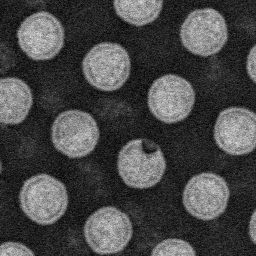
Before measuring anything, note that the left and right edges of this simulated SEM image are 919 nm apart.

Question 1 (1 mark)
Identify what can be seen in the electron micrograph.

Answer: a regular array of raised bodies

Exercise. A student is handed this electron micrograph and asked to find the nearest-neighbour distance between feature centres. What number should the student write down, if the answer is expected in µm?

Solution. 0.26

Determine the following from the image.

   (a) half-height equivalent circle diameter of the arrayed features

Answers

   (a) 161 nm